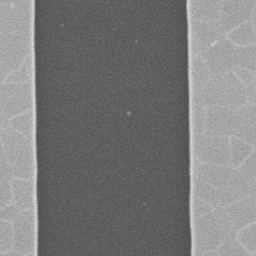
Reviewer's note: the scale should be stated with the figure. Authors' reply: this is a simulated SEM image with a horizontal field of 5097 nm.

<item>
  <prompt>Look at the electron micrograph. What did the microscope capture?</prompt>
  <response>wiring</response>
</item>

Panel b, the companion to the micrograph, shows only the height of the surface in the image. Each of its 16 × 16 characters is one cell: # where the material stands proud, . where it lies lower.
##..........####
##..........####
##..........####
##..........####
##..........####
##..........####
##..........####
##..........####
##..........####
##..........####
##..........####
##..........####
##..........####
##..........####
##..........####
##..........####